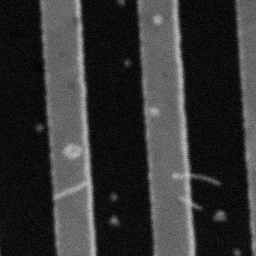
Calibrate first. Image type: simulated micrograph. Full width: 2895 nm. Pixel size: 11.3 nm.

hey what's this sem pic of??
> lines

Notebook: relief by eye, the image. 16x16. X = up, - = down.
---XX----XX----X
---XX----XX----X
---XX----XX----X
---XX----XX----X
---XX----XX----X
---XX----XX----X
---XX----XX----X
---XX----XX----X
---XX----XXX---X
---XX----XXX---X
---XXX---XXX---X
---XXX---XXX----
---XXX---XXX----
---XXX----XX----
---XXX----XX----
----XX----XX----